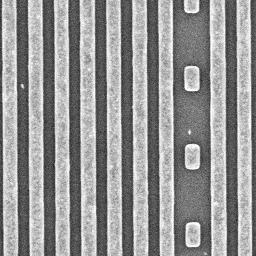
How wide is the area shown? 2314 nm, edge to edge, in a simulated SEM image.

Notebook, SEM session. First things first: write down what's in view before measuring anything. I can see wiring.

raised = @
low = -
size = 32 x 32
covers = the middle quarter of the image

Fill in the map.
@---@@@@---@@@---@@@----@@@-----
@---@@@@---@@@---@@@----@@@---@@
@---@@@@---@@@---@@@@---@@@---@@
@---@@@@---@@@---@@@@---@@@---@@
@---@@@@---@@@---@@@@---@@@---@@
@---@@@@---@@@---@@@@---@@@---@@
@---@@@@---@@@---@@@@---@@@----@
@---@@@@---@@@---@@@@---@@@-----
@---@@@@---@@@---@@@@---@@@-----
@---@@@@---@@@---@@@@---@@@-----
@---@@@@---@@@---@@@@---@@@-----
@---@@@@---@@@---@@@@---@@@-----
@---@@@@---@@@---@@@@---@@@-----
@---@@@@---@@@---@@@@---@@@-----
@---@@@@---@@@---@@@@---@@@-----
@---@@@@---@@@---@@@@---@@@-----
@---@@@@---@@@---@@@@---@@@-----
@---@@@@---@@@---@@@@---@@@-----
@---@@@@---@@@---@@@@---@@@-----
@---@@@@---@@@---@@@@---@@@-----
@---@@@@---@@@---@@@@---@@@----@
@---@@@@---@@@---@@@@---@@@---@@
@---@@@@---@@@---@@@@---@@@---@@
@---@@@@---@@@---@@@@---@@@---@@
@---@@@@---@@@---@@@@---@@@---@@
@---@@@@---@@@---@@@@---@@@---@@
@---@@@@---@@@---@@@@---@@@-----
@---@@@@---@@@---@@@@---@@@-----
@---@@@@---@@@---@@@@---@@@-----
@---@@@@---@@@---@@@@---@@@-----
@----@@@---@@@---@@@@---@@@-----
@----@@@---@@@---@@@@---@@@-----